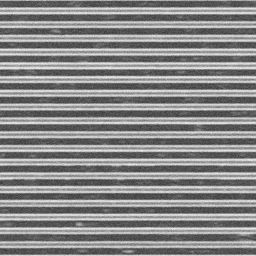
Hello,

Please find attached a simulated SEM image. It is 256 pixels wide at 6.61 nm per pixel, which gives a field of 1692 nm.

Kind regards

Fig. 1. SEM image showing parallel lines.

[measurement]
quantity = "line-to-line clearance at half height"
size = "52.1 nanometres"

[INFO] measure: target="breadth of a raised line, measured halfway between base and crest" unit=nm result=39.7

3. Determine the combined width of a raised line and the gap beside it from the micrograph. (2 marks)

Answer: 90.8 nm